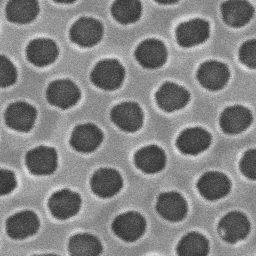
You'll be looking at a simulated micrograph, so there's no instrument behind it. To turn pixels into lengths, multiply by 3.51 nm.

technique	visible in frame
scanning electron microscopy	a regular array of holes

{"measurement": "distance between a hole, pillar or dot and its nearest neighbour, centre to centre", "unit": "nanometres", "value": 165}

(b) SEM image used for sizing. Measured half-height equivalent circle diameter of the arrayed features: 0.119 microns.